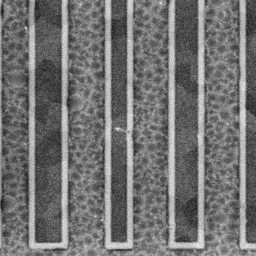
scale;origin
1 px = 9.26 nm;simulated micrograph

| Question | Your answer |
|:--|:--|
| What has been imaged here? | one or a few lines or trenches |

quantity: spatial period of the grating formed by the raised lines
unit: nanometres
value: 640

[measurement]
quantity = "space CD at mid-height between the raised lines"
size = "394 nanometers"